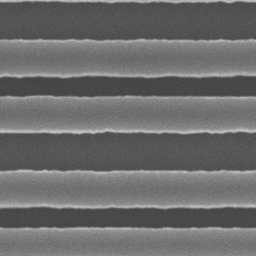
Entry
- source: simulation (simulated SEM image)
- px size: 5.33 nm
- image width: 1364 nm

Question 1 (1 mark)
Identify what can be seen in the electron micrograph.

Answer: lines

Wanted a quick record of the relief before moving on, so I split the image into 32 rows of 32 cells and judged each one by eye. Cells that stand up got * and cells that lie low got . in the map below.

................................
................................
................................
................................
................................
********************************
********************************
********************************
********************************
**********...********.*******...
................................
................................
********************************
********************************
********************************
********************************
*************.***************..*
................................
................................
................................
................................
************..******************
********************************
********************************
********************************
********************************
................................
................................
*.**.**.**********..**..****.*..
********************************
********************************
********************************